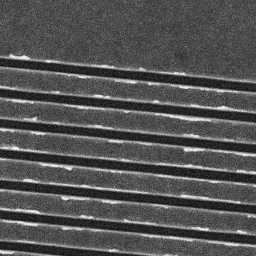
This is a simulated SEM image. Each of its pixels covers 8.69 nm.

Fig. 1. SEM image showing parallel lines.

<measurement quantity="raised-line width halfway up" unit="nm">182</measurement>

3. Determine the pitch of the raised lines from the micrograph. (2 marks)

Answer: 0.264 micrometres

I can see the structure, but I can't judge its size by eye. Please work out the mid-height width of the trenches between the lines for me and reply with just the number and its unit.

82.1 nm